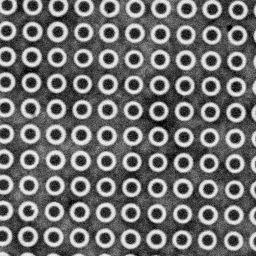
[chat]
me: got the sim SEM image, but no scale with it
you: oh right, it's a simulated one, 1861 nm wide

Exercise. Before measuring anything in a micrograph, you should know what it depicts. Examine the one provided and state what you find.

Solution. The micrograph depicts an array of small figures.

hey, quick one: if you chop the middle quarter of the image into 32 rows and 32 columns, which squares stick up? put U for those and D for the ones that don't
DDDDUUDDDDUUUDDDUUUDDDUUUUDDDUUU
DDDDDDDDDDDDDDDDDDDDDDDDDDDDDDDD
DDDDDDDDDDDDDDDDDDDDDDDDDDDDDDDD
DDDUUUDDDUUUUDDDUUUDDDUUUDDDDUUD
DDDUUUUDDUUUUDDUUUUUDDUUUUDDUUUU
DDUUUUUDDUUUUDDUUUUUDDUUUUDDUUUU
DDDUUUDDDUUUUDDDUUUDDDUUUUDDUUUU
DDDDDDDDDDDDDDDDDDDDDDDUUDDDDUUD
DDDDDDDDDDDDDDDDDDDDDDDDDDDDDDDD
DDDUUUDDDDUUDDDDDUDDDDDDDDDDDDDD
DDUUUUUDDUUUUDDUUUUDDDUUUUDDUUUU
DDUUUUUDDUUUUDDUUUUUDUUUUUDDUUUU
DDUUUUUDDUUUUDDUUUUDDUUUUUDDUUUU
DDDDUDDDDDUUDDDDUUUDDDUUUDDDUUUU
DDDDDDDDDDDDDDDDDDDDDDDDDDDDDDDD
DDDDUDDDDDDDDDDDDDDDDDDDDDDDDDDD
DDUUUUDDDUUUUDDDUUUDDDUUUDDDDUUD
DDUUUUUDUUUUUDDUUUUDDUUUUUDDUUUU
DDUUUUUDUUUUUDDUUUUDDUUUUUDDUUUU
DDDUUUDDDUUUUDDUUUUDDDUUUDDDUUUU
DDDDDDDDDDDDDDDDDDDDDDDDDDDDDUUD
DDDDDDDDDDDDDDDDDDDDDDDDDDDDDDDD
DDDUUUDDDUUUDDDDUUDDDDDUDDDDDUUD
DDUUUUDDUUUUUDDUUUUDDDUUUDDDUUUU
DDUUUUDDUUUUUDDUUUUDDUUUUUDDUUUU
DDUUUUDDDUUUUDDUUUUDDUUUUDDDUUUU
DDDDDDDDDDDDDDDDUUDDDDUUUDDDUUUD
DDDDDDDDDDDDDDDDDDDDDDDDDDDDDDDD
DDDUUDDDDDDDDDDDDDDDDDDDDDDDDDDD
DDUUUUDDDUUUDDDUUUUDDDUUUDDDUUUD
DDUUUUDDUUUUUDDUUUUDDUUUUUDUUUUU
DDUUUUDDUUUUUDDUUUUDDUUUUUDUUUUU